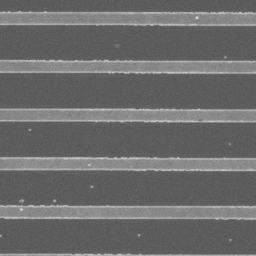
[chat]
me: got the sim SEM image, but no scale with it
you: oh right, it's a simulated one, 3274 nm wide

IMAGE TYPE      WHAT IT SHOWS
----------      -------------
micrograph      lines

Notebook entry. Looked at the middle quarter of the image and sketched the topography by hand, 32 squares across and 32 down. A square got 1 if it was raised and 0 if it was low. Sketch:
11111111111111111111111111111111
11111111111111111111111111111111
00000000000000000000000000000000
00000000000000000000000000000000
00000000000000000000000000000000
00000000000000000000000000000000
00000000000000000000000000000000
00000000000000000000000000000000
00000000000000000000000000000000
00000000000000000000000000000000
00000000000000000000000000000000
11111111111111111111110111110100
11111111111111111111111111111111
11111111111111111111111111111111
00000000000000000000000000000000
00000000000000000000000000000000
00000000000000000000000000000000
00000000000000000000000000000000
00000000000000000000000000000000
00000000000000000000000000000000
00000000000000000000000000000000
00000000000000000000000000000000
00000000000000000000000000000000
11111111111011111111111100111000
11111111111111111111111111111111
11111111111111111111111111111111
00000000000100001111101111111111
00000000000000000000000000000000
00000000000000000000000000000000
00000000000000000000000000000000
00000000000000000000000000000000
00000000000000000000000000000000